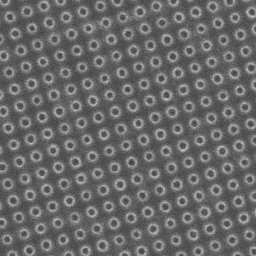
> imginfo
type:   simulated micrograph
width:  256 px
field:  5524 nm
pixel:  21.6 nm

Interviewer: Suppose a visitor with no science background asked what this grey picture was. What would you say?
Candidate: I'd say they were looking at a regular array of holes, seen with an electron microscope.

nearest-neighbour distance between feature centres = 376 nm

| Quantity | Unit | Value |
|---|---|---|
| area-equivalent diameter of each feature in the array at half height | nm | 160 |